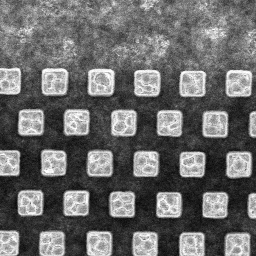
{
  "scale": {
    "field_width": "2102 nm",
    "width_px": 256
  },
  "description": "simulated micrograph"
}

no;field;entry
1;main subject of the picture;a regular array of raised bodies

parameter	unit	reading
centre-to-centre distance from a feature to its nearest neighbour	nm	376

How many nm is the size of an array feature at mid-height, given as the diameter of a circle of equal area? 227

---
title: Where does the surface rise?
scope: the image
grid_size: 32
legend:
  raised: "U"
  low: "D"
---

DDDDDDDDDDDDDDDDDDDDDDDDDDDDDDDD
DDDDDDDDDDDDDDDDDDDDDDDDDDDDDDDD
DDDDDDDDDDDDDDDDDDDDDDDDDDDDDDDD
DDDDDDDDDDDDDDDDDDDDDDDDDDDDDDDD
DDDDDDDDDDDDDDDDDDDDDDDDDDDDDDDD
DDDDDDDDDDDDDDDDDDDDDDDDDDDDDDDD
DDDDDDDDDDDDDDDDDDDDDDDDDDDDDDDD
DDDDDDDDDDDDDDDDDDDDDDDDDDDDDDDD
DDDDDDDDDDDDDDDDDDDDDDDDDDDDDDDD
UUDDDUUUDDDUUUDDDUUUDDDUUUDDUUUD
UUDDDUUUDDDUUUDDDUUUDDDUUUDDUUUD
UUDDDUUUDDDUUUDDDUUUDDDUUDDDUUUD
DDDDDDDDDDDDDDDDDDDDDDDDDDDDDDDD
DDDDDDDDDDDDDDDDDDDDDDDDDDDDDDDD
DDUUUDDDUUUDDDUUUDDDUUUDDUUUDDDU
DDUUUDDDUUUDDDUUUDDDUUUDDUUUDDDU
DDUUUDDDUUUDDDUUUDDDUUUDDUUUDDDU
DDDDDDDDDDDDDDDDDDDDDDDDDDDDDDDD
DDDDDDDDDDDDDDDDDDDDDDDDDDDDDDDD
UUDDDUUUDDDUUUDDDUUUDDDUUUDDUUUD
UUDDDUUUDDDUUUDDDUUUDDDUUUDDUUUD
UUDDDUUUDDDUUUDDDUUUDDDUUUDDUUUD
DDDDDDDDDDDDDDDDDDDDDDDDDDDDDDDD
DDDDDDDDDDDDDDDDDDDDDDDDDDDDDDDD
DDUUUDDDUUUDDDUUUDDDUUUDDUUUDDDU
DDUUUDDDUUUDDDUUUDDDUUUDDUUUDDDU
DDUUUDDDUUUDDDUUUDDDUUUDDUUUDDDU
DDDDDDDDDDDDDDDDDDDDDDDDDDDDDDDD
DDDDDDDDDDDDDDDDDDDDDDDDDDDDDDDD
UUDDDUUUDDDUUUDDDUUUDDDUUDDDUUUD
UUDDDUUUDDDUUUDDDUUUDDDUUDDDUUUD
UUDDDUUUDDDUUUDDDUUUDDDUUDDDUUUD